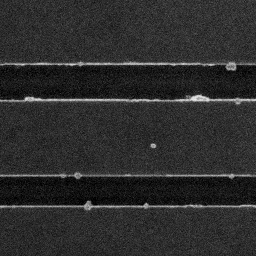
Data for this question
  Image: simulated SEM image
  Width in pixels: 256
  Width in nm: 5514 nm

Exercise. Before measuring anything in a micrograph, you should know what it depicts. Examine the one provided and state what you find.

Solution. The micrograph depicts lines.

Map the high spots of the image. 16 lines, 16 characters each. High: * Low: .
****************
****************
****************
****************
................
................
****************
****************
****************
****************
****************
................
................
****************
****************
****************